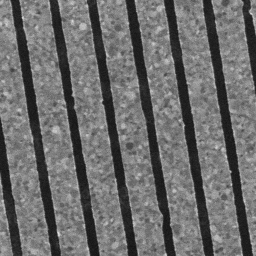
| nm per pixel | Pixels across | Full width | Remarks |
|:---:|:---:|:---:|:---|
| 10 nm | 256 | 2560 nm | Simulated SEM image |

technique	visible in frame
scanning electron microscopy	parallel lines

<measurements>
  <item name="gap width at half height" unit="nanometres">99.9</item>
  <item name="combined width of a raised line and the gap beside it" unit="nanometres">378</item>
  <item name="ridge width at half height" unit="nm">275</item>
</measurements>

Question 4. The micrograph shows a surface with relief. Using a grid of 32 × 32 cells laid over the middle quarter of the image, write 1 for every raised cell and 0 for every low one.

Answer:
01111111000111111100111111100011
00111111000111111100011111110011
00111111100111111100011111110011
00111111100111111100011111110011
00111111100011111100011111110001
00111111100011111110011111110001
00111111100011111110001111110001
00111111100011111110001111110001
00011111110011111110001111111001
00011111100011111110001111111001
00011111110001111110001111111000
10011111110001111111001111111000
10011111110001111111001111111000
10011111110001111111000111111000
10001111110001111111000111111100
10001111111001111111000111111100
10001111111001111111100111111100
10001111111000111111100111111100
11001111111000111111100111111100
11001111111000111111100111111100
11000111111100111111100011111110
11000111111100111111100011111110
11000111111100111111100011111110
11000111111100011111110011111110
11100111111100011111110011111110
11100011111100011111110001111110
11100011111100011111110001111111
11100011111110011111110001111111
11100011111110011111110001111111
11100011111110001111111001111111
11100011111110001111111001111111
11110001111110001111111000111111